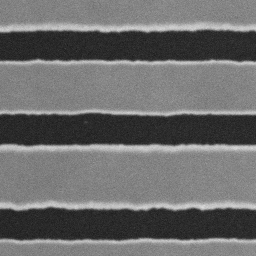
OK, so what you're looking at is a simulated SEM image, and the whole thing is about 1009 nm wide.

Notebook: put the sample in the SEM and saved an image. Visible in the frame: lines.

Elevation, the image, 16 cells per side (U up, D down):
UUUUUUUUUUUUUUUU
UUUUUUUUUUUUUUUU
DDDDDDDDDDDDDDDD
DDDDDDDDDDDDDDDD
UUUUUUUUUUUUUUUU
UUUUUUUUUUUUUUUU
UUUUUUUUUUUUUUUU
DDDDDDDDDDDDDDDD
DDDDDDDDDDDDDDDD
UUUUUUUUUUUUUUUU
UUUUUUUUUUUUUUUU
UUUUUUUUUUUUUUUU
UUUUUUUUUUUUUUUU
DDDDDDDDDDDDDDDD
DDDDDDDDDDDDDDDD
UUUUUUUUUUUUUUUU